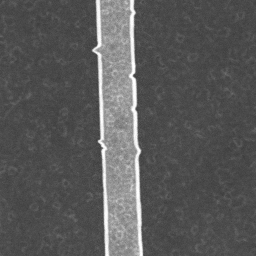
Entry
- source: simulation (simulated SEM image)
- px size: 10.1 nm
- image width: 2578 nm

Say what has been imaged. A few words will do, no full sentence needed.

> one or a few lines or trenches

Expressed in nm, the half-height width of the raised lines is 330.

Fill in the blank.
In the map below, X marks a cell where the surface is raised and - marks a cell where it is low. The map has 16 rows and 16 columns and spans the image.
------XX--------
------XX--------
------XX--------
------XX--------
------XX--------
------XX--------
------XX--------
------XX--------
------XX--------
------XXX-------
-------XX-------
-------XX-------
-------XX-------
-------XX-------
-------XX-------
-------XX-------